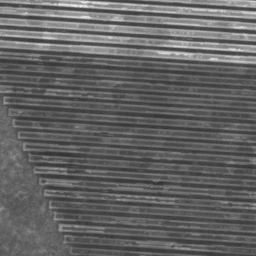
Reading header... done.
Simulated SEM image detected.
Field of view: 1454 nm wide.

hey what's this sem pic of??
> parallel lines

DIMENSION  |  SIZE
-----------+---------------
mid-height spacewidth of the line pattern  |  28.3 nanometers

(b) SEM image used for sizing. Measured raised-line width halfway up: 34 nm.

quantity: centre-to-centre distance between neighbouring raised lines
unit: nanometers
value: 63.7